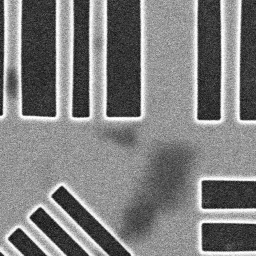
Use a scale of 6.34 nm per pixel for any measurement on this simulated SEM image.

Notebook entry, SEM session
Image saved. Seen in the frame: groups of lines, slits or small figures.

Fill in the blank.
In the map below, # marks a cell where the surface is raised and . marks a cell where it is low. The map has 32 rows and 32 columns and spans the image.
.##....##..##.....#######...##..
.##....##..##.....#######...##..
.##....##..##.....#######...##..
.##....##..##.....#######...##..
.##....##..##.....#######...##..
.##....##..##.....#######...##..
.##....##..##.....#######...##..
.##....##..##.....#######...##..
.##....##..##.....#######...##..
.##....##..##.....#######...##..
.##....##..##.....#######...##..
.##....##..##.....#######...##..
.##....##..##.....#######...##..
.##....##..##.....#######...##..
###....##..##.....#######...##..
################################
################################
################################
################################
################################
################################
################################
##########################......
#######.#################.......
#######..################.......
#######...###############.......
####..##...#####################
####...##...####################
#####...##...############.......
#...##...##...###########.......
#...###...##...##########.......
##...###...##...##########....##